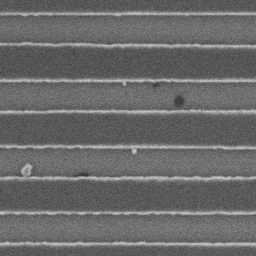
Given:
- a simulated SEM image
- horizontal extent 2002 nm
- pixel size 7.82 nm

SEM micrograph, lines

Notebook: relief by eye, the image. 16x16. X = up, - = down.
XXXXXXXXXXXXXXXX
----------------
----------------
XXXXXXXXXXXXXXXX
XXXXXXXXXXXXXXXX
----------------
----------------
XXXXXXXXXXXXXXXX
XXXXXXXXXXXXXXXX
----------------
----------------
XXXXXXXXXXXXXXXX
XXXXXXXXXXXXXXXX
----------------
----------------
XXXXXXXXXXXXXXXX